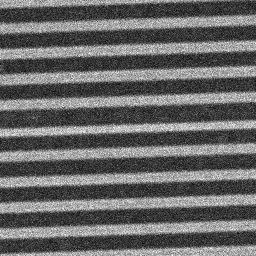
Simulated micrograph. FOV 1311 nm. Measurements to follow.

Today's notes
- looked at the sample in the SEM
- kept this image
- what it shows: parallel lines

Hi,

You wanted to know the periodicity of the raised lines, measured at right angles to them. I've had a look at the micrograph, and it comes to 0.131 µm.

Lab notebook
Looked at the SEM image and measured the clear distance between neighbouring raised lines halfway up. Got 83.2 nm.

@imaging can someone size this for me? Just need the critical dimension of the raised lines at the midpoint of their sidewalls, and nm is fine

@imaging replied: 48